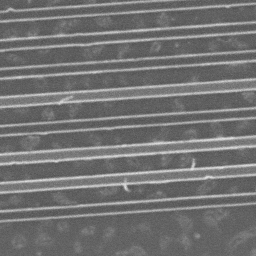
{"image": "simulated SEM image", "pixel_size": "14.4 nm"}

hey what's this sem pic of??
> parallel lines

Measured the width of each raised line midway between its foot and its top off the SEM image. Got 0.151 µm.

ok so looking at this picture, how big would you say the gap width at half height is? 262 nm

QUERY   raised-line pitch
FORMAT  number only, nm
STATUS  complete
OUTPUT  409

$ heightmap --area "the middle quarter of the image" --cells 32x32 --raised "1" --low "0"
11111111111111111111111111111000
11111111111111100000000000000000
10000000000000000000000000000000
00000000000000000000000000000000
00000000000000000000000000000000
00000000000000000000000011111111
00000000000011111111111111111111
11111111111111111111111111111111
11111111111111111000000000000000
10000000000000000000000000000000
00000000000000000000000000000000
00000000000000000000000000000000
00000000000000000000000000111111
00000000000011111111111111111111
11111111111111111111111111111111
11111111111111111100000000000000
11100000000000000000000000000000
00000000000000000000000000000000
00000000000000000000000000000000
00000000000000000000000000000111
00000000000000011111111111111111
11111111111111111111111111111111
11111111111111111111100000000000
11111100000000000000000000000000
00000000000000000000000000000000
00000000000000000000000000000000
00000000000000000000000000001111
00000000000000000111111111111111
00011111111111111111111111111111
11111111111111111111111000000000
11111111100000010000000000000000
00000000000000000000000000000000